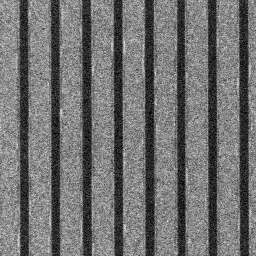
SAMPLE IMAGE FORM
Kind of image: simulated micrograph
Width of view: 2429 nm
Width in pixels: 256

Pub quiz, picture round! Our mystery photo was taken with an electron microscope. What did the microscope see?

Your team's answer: parallel lines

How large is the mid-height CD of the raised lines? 101 nm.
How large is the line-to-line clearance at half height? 197 nm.